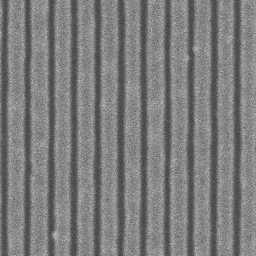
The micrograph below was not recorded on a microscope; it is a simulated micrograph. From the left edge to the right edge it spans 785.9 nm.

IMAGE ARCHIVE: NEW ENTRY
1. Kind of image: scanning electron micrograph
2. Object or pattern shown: parallel lines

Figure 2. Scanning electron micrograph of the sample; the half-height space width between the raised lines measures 21.1 nm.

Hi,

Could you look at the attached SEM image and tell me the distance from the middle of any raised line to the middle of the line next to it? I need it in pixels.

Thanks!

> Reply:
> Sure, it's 23.3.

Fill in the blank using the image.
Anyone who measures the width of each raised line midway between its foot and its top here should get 50.2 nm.